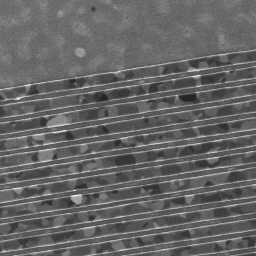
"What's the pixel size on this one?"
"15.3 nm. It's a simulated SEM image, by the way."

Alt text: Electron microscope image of parallel lines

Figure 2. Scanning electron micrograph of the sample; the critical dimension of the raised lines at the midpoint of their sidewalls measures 183 nm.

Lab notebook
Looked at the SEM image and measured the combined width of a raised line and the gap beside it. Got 255 nanometres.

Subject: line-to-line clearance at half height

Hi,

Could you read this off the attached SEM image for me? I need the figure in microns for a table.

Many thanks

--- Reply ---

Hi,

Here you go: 0.0737